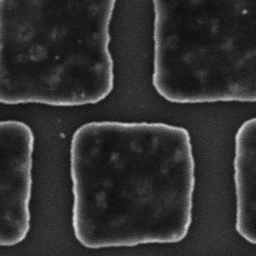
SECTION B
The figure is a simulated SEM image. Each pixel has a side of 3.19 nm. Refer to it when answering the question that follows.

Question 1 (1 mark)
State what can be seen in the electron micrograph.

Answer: raised bodies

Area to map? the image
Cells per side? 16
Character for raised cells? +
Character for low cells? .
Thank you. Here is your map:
+++++++...++++++
+++++++...++++++
+++++++...++++++
+++++++...++++++
+++++++...++++++
+++++++...++++++
...++...........
................
++...+++++++...+
++...+++++++...+
++..++++++++...+
++...+++++++...+
++...+++++++...+
++...+++++++...+
++...+++++++...+
................